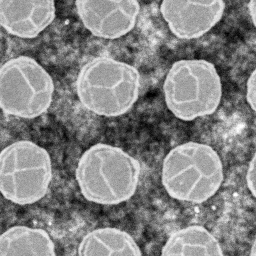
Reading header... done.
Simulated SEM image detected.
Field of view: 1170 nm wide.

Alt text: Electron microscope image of raised bodies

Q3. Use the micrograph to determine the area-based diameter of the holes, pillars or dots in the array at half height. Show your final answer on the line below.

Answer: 0.271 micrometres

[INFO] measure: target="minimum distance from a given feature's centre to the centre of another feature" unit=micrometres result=0.383